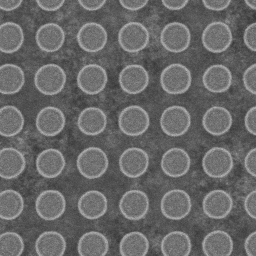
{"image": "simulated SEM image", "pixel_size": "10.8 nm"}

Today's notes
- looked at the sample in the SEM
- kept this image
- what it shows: a regular array of raised bodies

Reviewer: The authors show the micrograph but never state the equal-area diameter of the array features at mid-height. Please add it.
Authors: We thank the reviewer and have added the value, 300 nm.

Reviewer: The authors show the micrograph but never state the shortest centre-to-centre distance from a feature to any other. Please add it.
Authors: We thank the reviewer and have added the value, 450 nanometres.